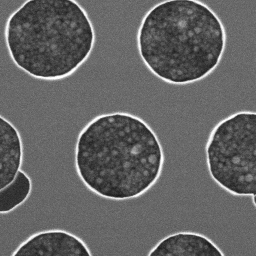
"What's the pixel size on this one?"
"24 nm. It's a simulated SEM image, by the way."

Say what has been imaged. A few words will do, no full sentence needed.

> holes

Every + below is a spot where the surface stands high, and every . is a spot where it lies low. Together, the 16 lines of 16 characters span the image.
+....+++++...+++
+.....+++.....++
+.....+++.....++
+....++++.....++
++..++++++...+++
++++++++++++++++
++++++++++++++++
++++++...+++++..
.++++.....+++...
.++++.....+++...
.++++.....+++...
..+++....+++++..
.+++++++++++++++
++++++++++++++++
++++++++++++++++
+....+++++...+++